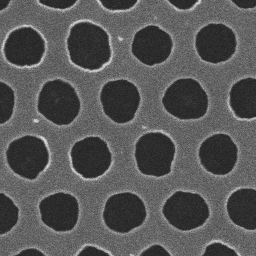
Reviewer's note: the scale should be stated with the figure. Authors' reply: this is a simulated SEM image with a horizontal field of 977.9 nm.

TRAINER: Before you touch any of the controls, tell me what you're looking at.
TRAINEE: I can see a regular array of holes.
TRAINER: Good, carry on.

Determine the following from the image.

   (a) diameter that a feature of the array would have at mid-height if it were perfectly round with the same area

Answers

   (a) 158 nm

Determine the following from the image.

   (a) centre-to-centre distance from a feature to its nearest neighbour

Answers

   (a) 63.1 px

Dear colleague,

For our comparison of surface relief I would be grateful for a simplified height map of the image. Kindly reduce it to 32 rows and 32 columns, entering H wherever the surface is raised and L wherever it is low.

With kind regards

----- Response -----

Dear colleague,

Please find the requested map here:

LHHHHLLLLHHHHLLLLHHHHHLLHHHHHLLL
HHHHHHHHHHHHHHHHHHHHHHHHHHHHHHHH
HHHHHHHHHHHHHHHHHHHHHHHHHHHHHHHH
HHHLHHHHHLLLLHHHHHLLHHHHHLLLLHHH
HLLLLHHHHLLLLHHHHLLLLHHHHLLLLHHH
HLLLLHHHLLLLLLHHHLLLLHHHLLLLLLHH
HLLLLHHHHLLLLLHHHLLLLHHHHLLLLHHH
HLLLLHHHHLLLLLHHHLLLLHHHHHLLHHHH
HHHHHHHHHHHLHHHHHHHHHHHHHHHHHHHH
HHHHHHHHHHHHHHHHHHHHHHHHHHHHHHHH
LHHHHHLLLHHHHLLLLHHHHLLLLHHHHLLL
LLHHHLLLLHHHHLLLLHHHHLLLLLHHHLLL
LLHHHLLLLLHHHLLLLHHHLLLLLLHHHLLL
LLHHHLLLLLHHHLLLLHHHHLLLLLHHHLLL
LHHHHLLLLLHHHLLLLHHHHHLLLHHHHHLL
HHHHHHHLHHHHHHHHHHHHHHHHHHHHHHHH
HHHHHHHHHHHHHHHHHHHHHHHHHHHHHHHH
HHLLLHHHHHLLLHHHHLLLLHHHHHLLLHHH
HLLLLLHHHLLLLHHHHLLLLLHHHLLLLLHH
HLLLLLHHHLLLLLHHHLLLLLHHHLLLLLHH
HLLLLLHHHLLLLLHHHLLLLHHHHLLLLHHH
HHLLLHHHHHLLLHHHHHLLLHHHHHLLLHHH
HHHHHHHHHHHHHHHHHHHHHHHHHHHHHHHH
HHHHHHHHHHHHHHHHHHHHHHHHHHHHHHHH
LHHHHHLLLHHHHHLLLHHHHLLLLHHHHLLL
LLHHHLLLLLHHHLLLLLHHHLLLLLHHLLLL
LLHHHLLLLLHHHLLLLLHHLLLLLLHHLLLL
LLHHHLLLLLHHHLLLLLHHHLLLLLHHHLLL
LLHHHHLLLHHHHHLLLHHHHHLLHHHHHHHL
HHHHHHHHHHHHHHHHHHHHHHHHHHHHHHHH
HHHHHHHHHHHHHHHHHHHHHHHHHHLLHHHH
HHHLLHHHHHLLLHHHHHLLLHHHHHLLLHHH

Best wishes